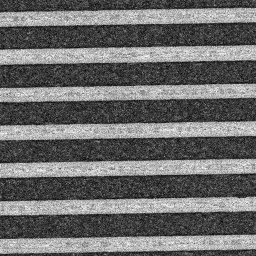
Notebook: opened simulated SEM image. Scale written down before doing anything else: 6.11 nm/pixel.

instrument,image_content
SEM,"parallel lines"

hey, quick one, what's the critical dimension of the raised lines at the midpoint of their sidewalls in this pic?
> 63.4 nm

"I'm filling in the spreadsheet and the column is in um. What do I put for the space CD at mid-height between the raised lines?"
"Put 0.169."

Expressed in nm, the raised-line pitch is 231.